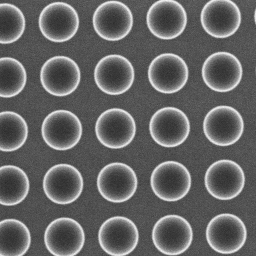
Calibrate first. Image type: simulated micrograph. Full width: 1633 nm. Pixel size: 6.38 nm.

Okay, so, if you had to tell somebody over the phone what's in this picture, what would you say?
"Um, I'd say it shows an array of small figures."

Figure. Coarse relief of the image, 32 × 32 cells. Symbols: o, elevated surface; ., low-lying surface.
o.....oo.....oo....ooo....ooo...
ooo..oooo...oooo...oooo..ooooo..
ooo..ooooo..oooo..ooooo..ooooo..
ooo..ooooo..oooo...oooo..ooooo..
ooo...ooo....ooo....oo.....oo...
................................
................................
oo....ooo....ooo...oooo...oooo..
ooo..ooooo..ooooo..oooo..ooooo..
ooo..ooooo..ooooo..oooo..ooooo..
ooo..ooooo..oooo...oooo...oooo..
oo....ooo....ooo....oo..........
................................
.....................o.....oo...
ooo...ooo....ooo...oooo...oooo..
ooo..ooooo..ooooo..ooooo.ooooo..
ooo..ooooo..ooooo..ooooo..oooo..
ooo...oooo..oooo...oooo...oooo..
oo.....oo.......................
................................
..............o.....ooo....ooo..
ooo...oooo...oooo..ooooo..oooo..
oooo.ooooo..ooooo..ooooo..ooooo.
oooo.ooooo..ooooo..ooooo..oooo..
ooo...oooo...ooo....ooo....ooo..
oo..............................
................................
.o.....oo....ooo....ooo....ooo..
ooo...oooo...oooo..ooooo..ooooo.
oooo..ooooo.ooooo..ooooo..ooooo.
oooo..oooo...oooo..ooooo..oooo..
ooo...oooo...ooo....ooo....oo...